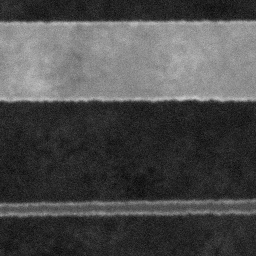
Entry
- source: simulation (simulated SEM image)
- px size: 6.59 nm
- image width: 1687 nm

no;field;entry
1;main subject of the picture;lines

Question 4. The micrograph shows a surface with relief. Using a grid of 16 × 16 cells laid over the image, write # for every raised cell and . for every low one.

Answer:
................
################
################
################
################
################
................
................
................
................
................
................
...............#
................
................
................